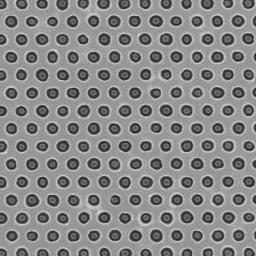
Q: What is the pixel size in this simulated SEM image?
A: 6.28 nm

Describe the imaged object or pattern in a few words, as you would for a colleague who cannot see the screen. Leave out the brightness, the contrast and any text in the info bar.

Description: a regular array of ring-shaped grooves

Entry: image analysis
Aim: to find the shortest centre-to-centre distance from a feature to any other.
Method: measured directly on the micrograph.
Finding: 0.125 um